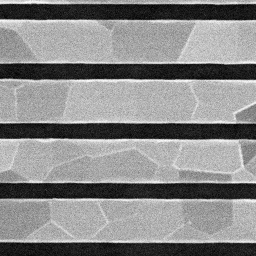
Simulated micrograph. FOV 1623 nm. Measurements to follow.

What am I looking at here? wiring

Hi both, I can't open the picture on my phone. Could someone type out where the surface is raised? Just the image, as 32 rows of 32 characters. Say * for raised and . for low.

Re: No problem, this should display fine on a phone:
................................
................................
................................
********************************
********************************
********************************
********************************
********************************
................................
................................
********************************
********************************
********************************
********************************
********************************
................................
................................
..***.***.......*...............
********************************
********************************
********************************
********************************
********************************
................................
................................
********************************
********************************
********************************
********************************
********************************
................................
................................